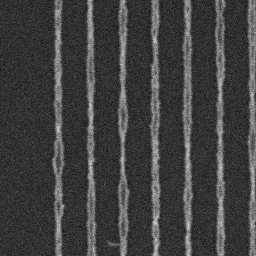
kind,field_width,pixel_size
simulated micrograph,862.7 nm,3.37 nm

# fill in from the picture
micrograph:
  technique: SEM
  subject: parallel lines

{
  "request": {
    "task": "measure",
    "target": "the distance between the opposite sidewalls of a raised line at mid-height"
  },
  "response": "16.4 nanometres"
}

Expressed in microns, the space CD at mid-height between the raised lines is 0.0947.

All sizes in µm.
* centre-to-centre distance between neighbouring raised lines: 0.109